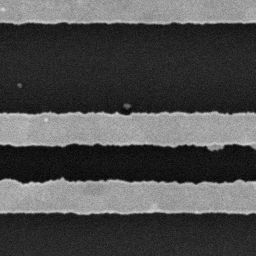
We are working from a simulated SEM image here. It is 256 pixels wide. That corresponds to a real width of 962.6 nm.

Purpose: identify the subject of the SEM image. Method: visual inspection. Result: lines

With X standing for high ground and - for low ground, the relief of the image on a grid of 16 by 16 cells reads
XXXXXXXXXXXXXXXX
----------------
----------------
----------------
----------------
----------------
----------------
XXXXXXXXXXXXXXXX
XXXXXXXXXXXXXXXX
----------------
----------------
XXXXXXXXXXXXXXXX
XXXXXXXXXXXXXXXX
----------------
----------------
----------------